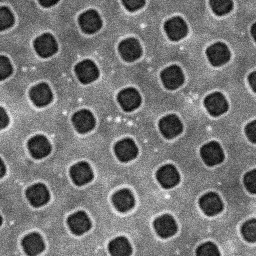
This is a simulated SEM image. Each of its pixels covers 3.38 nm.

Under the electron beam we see a regular array of holes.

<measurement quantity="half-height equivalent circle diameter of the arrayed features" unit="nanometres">85.9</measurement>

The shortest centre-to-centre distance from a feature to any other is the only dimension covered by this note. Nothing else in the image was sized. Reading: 167 nm